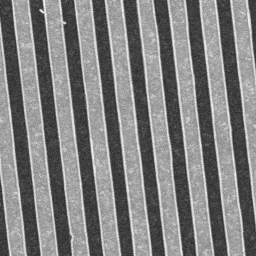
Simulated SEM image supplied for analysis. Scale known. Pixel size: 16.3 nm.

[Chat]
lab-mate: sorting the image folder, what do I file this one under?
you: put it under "parallel lines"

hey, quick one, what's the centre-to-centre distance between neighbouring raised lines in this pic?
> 505 nanometers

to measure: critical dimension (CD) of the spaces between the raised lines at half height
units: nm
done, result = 247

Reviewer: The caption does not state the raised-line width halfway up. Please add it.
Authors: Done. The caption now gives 16 pixels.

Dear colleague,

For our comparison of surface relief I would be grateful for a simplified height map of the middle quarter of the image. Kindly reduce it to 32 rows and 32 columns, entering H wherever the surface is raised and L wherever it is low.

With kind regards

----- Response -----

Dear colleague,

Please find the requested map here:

HLLLLHHHHLLLLHHHLLLLHHHHLLLLHHHH
HLLLLHHHHLLLLHHHLLLLHHHHLLLLHHHH
HLLLLHHHHLLLLHHHLLLLLHHHLLLLHHHH
HLLLLHHHHLLLLHHHHLLLLHHHLLLLLHHH
HLLLLHHHHLLLLHHHHLLLLHHHLLLLLHHH
HLLLLHHHHLLLLHHHHLLLLHHHHLLLLHHH
HLLLLHHHHLLLLHHHHLLLLHHHHLLLLHHH
HHLLLLHHHLLLLHHHHLLLLHHHHLLLLHHH
HHLLLLHHHLLLLHHHHLLLLHHHHLLLLHHH
HHLLLLHHHHLLLHHHHLLLLHHHHLLLLHHH
HHLLLLHHHHLLLHHHHLLLLHHHHLLLLHHH
HHLLLLHHHHLLLLHHHLLLLHHHHLLLLHHH
HHLLLLHHHHLLLLHHHHLLLHHHHLLLLHHH
HHLLLLHHHHLLLLHHHHLLLLHHHLLLLHHH
HHLLLLHHHHLLLLHHHHLLLLHHHHLLLLHH
HHLLLLHHHHLLLLHHHHLLLLHHHHLLLLHH
HHLLLLLHHHLLLLHHHHLLLLHHHHLLLLHH
HHLLLLLHHHLLLLHHHHLLLLHHHHLLLLHH
HHHLLLLHHHLLLLLHHHLLLLHHHHLLLLHH
HHHLLLLHHHHLLLLHHHLLLLHHHHLLLLHH
HHHLLLLHHHHLLLLHHHLLLLHHHHLLLLHH
HHHLLLLHHHHLLLLHHHHLLLLHHHHLLLLH
HHHLLLLHHHHLLLLHHHHLLLLHHHHLLLLH
HHHLLLLHHHHLLLLHHHHLLLLHHHHLLLLH
HHHLLLLHHHHLLLLHHHHLLLLHHHHLLLLH
HHHHLLLLHHHLLLLHHHHLLLLHHHHLLLLH
HHHHLLLLHHHHLLLHHHHLLLLHHHHLLLLH
HHHHLLLLHHHHLLLHHHHLLLLHHHHLLLLH
HHHHLLLLHHHHLLLLHHHHLLLHHHHLLLLH
HHHHLLLLHHHHLLLLHHHHLLLHHHHLLLLH
HHHHLLLLHHHHLLLLHHHHLLLLHHHLLLLL
HHHHLLLLHHHHLLLLHHHHLLLLHHHHLLLL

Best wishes